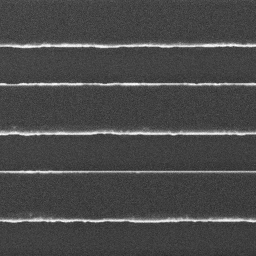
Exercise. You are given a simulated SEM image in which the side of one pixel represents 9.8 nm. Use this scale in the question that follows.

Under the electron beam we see lines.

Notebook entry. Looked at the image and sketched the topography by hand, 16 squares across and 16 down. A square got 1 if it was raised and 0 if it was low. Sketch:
1111111111111111
1111111111111111
1111111111111111
0000000000000000
0000000000000000
1111111111111111
1111111111111111
1111111111111111
0000000000000000
0000000000000000
0000000000000000
1111111111111111
1111111111111111
1111111111111111
0000000000000000
0000000000000000